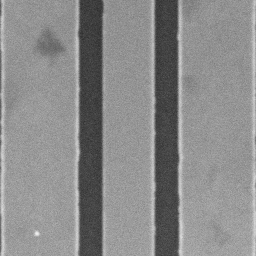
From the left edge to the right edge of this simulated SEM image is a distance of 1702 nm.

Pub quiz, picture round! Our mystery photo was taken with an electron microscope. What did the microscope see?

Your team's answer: lines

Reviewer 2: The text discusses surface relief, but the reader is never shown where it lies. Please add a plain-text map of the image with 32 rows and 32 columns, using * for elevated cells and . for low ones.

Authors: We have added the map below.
**********...******...**********
**********...******...**********
**********...******...**********
**********...******...**********
**********...******...**********
**********...******...**********
**********...******...**********
**********...******...**********
**********...******...**********
**********...******...**********
**********...******...**********
**********...******...**********
**********...******...**********
**********...******...**********
**********...******...**********
**********...******...**********
**********...******...**********
**********...******...**********
**********...******...**********
**********...******...**********
**********...******...**********
**********...******...**********
**********...******...**********
**********...******...**********
**********...******...**********
**********...******...**********
**********...******...**********
**********...******...**********
**********...******...**********
**********...******...**********
**********...******...**********
**********...******...**********